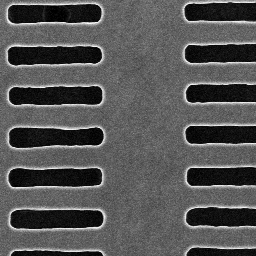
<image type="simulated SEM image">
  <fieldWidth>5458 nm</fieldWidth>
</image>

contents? holes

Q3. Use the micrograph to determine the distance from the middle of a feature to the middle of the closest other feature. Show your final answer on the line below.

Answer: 861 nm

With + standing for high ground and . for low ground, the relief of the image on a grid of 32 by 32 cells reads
++++++++++..++++++++++++........
+............++++++++++.........
+...........++++++++++++........
++++++++++++++++++++++++++++++++
++++++++++++++++++++++++++++++++
+++++++++++++++++++++++++++++...
+............++++++++++.........
+............++++++++++.........
++++++++++++++++++++++++++++++++
++++++++++++++++++++++++++++++++
++++++++++++++++++++++++++++++++
+............++++++++++.........
+............++++++++++.........
++++++++++++++++++++++++++++++++
++++++++++++++++++++++++++++++++
++++++++++++++++++++++++++++++++
+............++++++++++.........
+............++++++++++.........
++..++++++++++++++++++++++++++++
++++++++++++++++++++++++++++++++
++++++++++++++++++++++++++++++++
+............++++++++++.........
+............++++++++++.........
++++++++++++++++++++++++++++++++
++++++++++++++++++++++++++++++++
++++++++++++++++++++++++++++++++
++..........++++++++++++........
+............++++++++++.........
++.....+..++++++++++++++++++++++
++++++++++++++++++++++++++++++++
++++++++++++++++++++++++++++++++
++..........+++++++++++.........